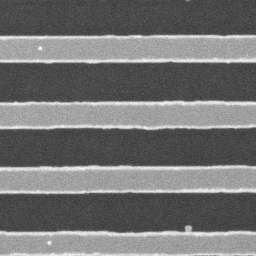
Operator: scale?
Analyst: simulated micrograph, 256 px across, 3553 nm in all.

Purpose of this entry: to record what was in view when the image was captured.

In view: lines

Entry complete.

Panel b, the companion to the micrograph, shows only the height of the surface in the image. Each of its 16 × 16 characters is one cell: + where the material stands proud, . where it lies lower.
................
................
++++++++++++++++
++++++++++++++++
................
................
++++++++++++++++
++++++++++++++++
................
................
++++++++++++++++
++++++++++++++++
................
................
...++.....+...++
++++++++++++++++